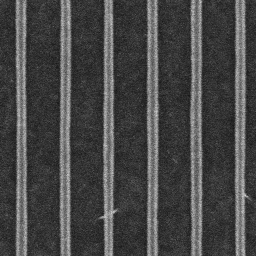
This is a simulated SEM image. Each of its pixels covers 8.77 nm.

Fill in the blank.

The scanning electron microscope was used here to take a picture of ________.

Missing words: parallel lines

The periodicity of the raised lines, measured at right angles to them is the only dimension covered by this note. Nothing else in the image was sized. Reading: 384 nm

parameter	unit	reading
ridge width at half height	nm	66.9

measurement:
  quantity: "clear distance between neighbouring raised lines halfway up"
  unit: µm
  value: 0.316